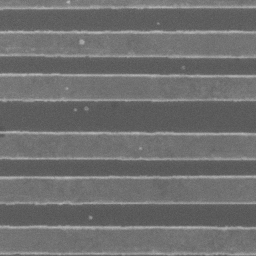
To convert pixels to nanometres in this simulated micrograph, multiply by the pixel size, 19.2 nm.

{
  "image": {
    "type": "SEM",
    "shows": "lines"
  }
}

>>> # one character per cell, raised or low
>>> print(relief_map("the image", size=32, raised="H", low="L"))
HHHHHHHHHHHHHHHHHHHHHHHHHHHHHHHH
LLLLLLLLLLLLLLLLLLLLLLLLLLLLLLLL
LLLLLLLLLLLLLLLLLLLLLLLLLLLLLLLL
LLLLLLLLLLLLLLLLLLLLLLLLLLLLLLLL
HHHHHHHHHHHHHHHHHHHHHHHHHHHHHHHH
HHHHHHHHHHHHHHHHHHHHHHHHHHHHHHHH
HHHHHHHHHHHHHHHHHHHHHHHHHHHHHHHH
LLLLLLLLLLLLLLLLLLLLLLLLLLLLLLLL
LLLLLLLLLLLLLLLLLLLLLLLLLLLLLLLL
HHHHHHHHHHHHHHHHHHHHLHHLLLLLLLLL
HHHHHHHHHHHHHHHHHHHHHHHHHHHHHHHH
HHHHHHHHHHHHHHHHHHHHHHHHHHHHHHHH
HHHHHHHHHHHHHHHHHHHHHHHHHHHHHHHH
LLLLLLLLLLLLLLLLLLLLLLLLLLLLLLLL
LLLLLLLLLLLLLLLLLLLLLLLLLLLLLLLL
LLLLLLLLLLLLLLLLLLLLLLLLLLLLLLLL
LLLLLLLLLLLLLLLLLLLLLLLLLLLLLLLL
HHHHHHHHHHHHHHHHHHHHHHHHHHHHHHHH
HHHHHHHHHHHHHHHHHHHHHHHHHHHHHHHH
HHHHHHHHHHHHHHHHHHHHHHHHHHHHHHHH
LLLLLLLLLLLLLLLLLLLLLLLLLLLLLLLL
LLLLLLLLLLLLLLLLLLLLLLLLLLLLLLLL
HHHHHHHHHHHHHHHHHHHHHHHHHHHHHHHH
HHHHHHHHHHHHHHHHHHHHHHHHHHHHHHHH
HHHHHHHHHHHHHHHHHHHHHHHHHHHHHHHH
LLLLLLLLLLLLLLLLLLLLLLLLLLLLLLLL
LLLLLLLLLLLLLLLLLLLLLLLLLLLLLLLL
LLLLLLLLLLLLLLLLLLLLLLLLLLLLLLLL
HHHHHHHHHHHHHHHLHHHHHHHHHHLLLHLL
HHHHHHHHHHHHHHHHHHHHHHHHHHHHHHHH
HHHHHHHHHHHHHHHHHHHHHHHHHHHHHHHH
HHHHHHHHHHHHHHHHHHHHHHHHHHHHHHHH